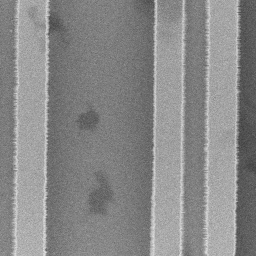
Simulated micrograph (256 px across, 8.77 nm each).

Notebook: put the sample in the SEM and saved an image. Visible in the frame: lines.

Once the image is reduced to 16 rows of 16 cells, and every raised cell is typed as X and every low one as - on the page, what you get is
XXX-------XXXXX-
XXX-------XXXXX-
XXX-------XXXXX-
XXX-------XXXXX-
XXX-------XXXXX-
XXX-------XXXXX-
XXX-------XXXXX-
XXX-------XXXXX-
XXX-------XXXXX-
XXX-------XXXXX-
XXX-------XXXXX-
XXX-------XXXXX-
XXX-------XXXXX-
XXX-------XXXXX-
XXX-------XXXXX-
XXX-------XXXXX-